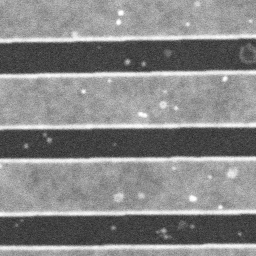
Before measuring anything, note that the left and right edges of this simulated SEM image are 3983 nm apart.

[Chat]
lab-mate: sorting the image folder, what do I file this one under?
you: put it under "lines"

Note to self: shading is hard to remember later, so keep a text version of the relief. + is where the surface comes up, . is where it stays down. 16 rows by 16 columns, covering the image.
++++++++++++++++
++++++++++++++++
+++++++.........
................
...............+
++++++++++++++++
++++++++++++++++
++++++++++++++++
................
................
++++++++++++++++
++++++++++++++++
++++++++++++++++
................
................
++++++++++++++++